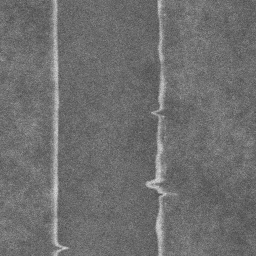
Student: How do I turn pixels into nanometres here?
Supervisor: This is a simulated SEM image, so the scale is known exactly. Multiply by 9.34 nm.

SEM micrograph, one or a few lines or trenches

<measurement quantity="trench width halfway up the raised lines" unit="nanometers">961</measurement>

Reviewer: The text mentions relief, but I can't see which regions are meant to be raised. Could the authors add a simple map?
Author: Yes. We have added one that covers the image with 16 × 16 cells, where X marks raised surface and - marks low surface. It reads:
XXX-------XXXXXX
XXX-------XXXXXX
XXX-------XXXXXX
XXX-------XXXXXX
XXX-------XXXXXX
XXXX------XXXXXX
XXXX------XXXXXX
XXX-------XXXXXX
XXXX------XXXXXX
XXX-------XXXXXX
XXX-------XXXXXX
XXXX------XXXXXX
XXX-------XXXXXX
XXXX------XXXXXX
XXXX------XXXXXX
XXXX------XXXXXX